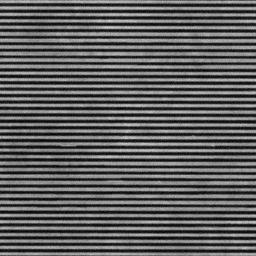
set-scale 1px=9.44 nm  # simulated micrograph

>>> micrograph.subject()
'parallel lines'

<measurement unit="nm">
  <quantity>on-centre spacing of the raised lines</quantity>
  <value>61.1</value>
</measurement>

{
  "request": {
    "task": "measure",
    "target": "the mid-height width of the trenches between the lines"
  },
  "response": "0.0342 micrometres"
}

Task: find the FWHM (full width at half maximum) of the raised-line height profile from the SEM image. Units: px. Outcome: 2.75